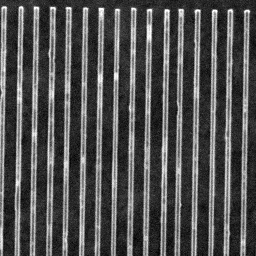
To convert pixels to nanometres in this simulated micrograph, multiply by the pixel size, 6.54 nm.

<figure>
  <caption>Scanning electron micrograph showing parallel lines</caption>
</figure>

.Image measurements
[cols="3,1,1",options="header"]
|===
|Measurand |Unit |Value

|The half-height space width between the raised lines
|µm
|0.08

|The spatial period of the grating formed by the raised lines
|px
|16.1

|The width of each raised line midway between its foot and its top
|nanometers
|28.6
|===